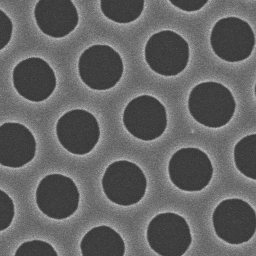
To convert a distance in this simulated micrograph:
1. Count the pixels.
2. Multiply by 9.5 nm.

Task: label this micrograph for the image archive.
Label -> a regular array of holes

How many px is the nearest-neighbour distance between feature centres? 67.6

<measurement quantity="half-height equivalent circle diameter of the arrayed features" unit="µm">0.429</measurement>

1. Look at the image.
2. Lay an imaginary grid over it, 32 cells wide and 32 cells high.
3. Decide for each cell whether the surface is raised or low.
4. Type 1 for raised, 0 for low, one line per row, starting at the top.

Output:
11111000011110000011110000111111
11110000001110000011111111111111
01110000001111000111111111100011
00111000011111111111111111100001
01111100111111111110000111000000
01111111111111111100000111000000
11111111110000011100000011100001
11100111110000011100000011110011
11000011110000011110000111111111
11000001110000011111111111111111
11000001111000011111111110001111
11000001111111111111111100000111
11110011111111110000111100000111
11111111111111110000011100000111
11111111000011100000011100000111
00011110000011100000011110001111
00001110000011110000111111111111
00001110000011111101111111111100
00001111000011111111111001111000
00001111111111111111100000111000
00011111111111000111100000111000
11111111111110000011100000011100
11111000011110000011100000111111
11111000001110000011110001111111
01110000001110000011111111111111
00111000001111100111111111100001
00111000011111111111111111100000
00111111111111111110000111100000
01111111111100111100000011100000
11111111111000011100000011100000
11100011110000001110000011111011
11000001110000001110000111111111